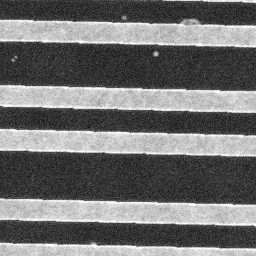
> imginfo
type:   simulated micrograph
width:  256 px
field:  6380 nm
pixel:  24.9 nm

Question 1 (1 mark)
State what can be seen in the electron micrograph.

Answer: lines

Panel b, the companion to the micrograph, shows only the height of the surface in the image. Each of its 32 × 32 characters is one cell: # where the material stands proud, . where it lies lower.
................................
................................
................................
################################
################################
....................############
................................
................................
................................
................................
................................
################################
################################
...............#################
................................
................................
############....................
################################
################################
................................
................................
................................
................................
................................
................................
########################........
################################
.......#########################
................................
................................
##..............................
################################